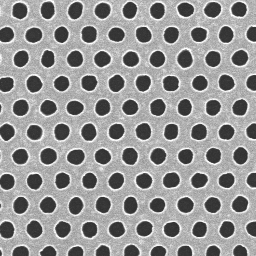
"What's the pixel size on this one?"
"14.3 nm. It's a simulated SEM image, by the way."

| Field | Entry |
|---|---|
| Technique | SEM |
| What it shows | a regular array of holes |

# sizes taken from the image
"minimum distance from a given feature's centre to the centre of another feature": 388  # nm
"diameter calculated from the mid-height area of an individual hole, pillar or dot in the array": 228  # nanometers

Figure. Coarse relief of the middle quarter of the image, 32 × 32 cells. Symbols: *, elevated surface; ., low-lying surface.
*...****..******..****..*****...
********************************
*************.******************
.****...****...***...****...****
.***....***....***....***....***
.***....***....***...****....***
.****..*****..*****..****...****
********************************
********************************
*...****...****...****...****...
*....***...****....**....****...
*....***...****....***...****...
**..****...****..*****...****..*
********************************
********************************
.****..*****...***...****...****
.***....***....***....***....***
.***....***....***....***....***
.****...****..*****..****...****
********************************
********************************
**..****...****...****...*****..
*....***...****...****...****...
*....***....***...****...****...
*....***...****...****...****...
********************************
********************************
.****..*****..******.*****..****
.****...****...***....***....***
..***...***....***....***....***
.****...****..*****..****...****
********************************